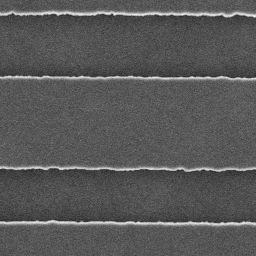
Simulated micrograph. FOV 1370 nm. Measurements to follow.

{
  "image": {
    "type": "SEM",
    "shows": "lines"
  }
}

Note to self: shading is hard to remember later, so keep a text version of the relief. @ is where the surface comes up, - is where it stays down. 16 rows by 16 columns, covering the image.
@@@@@@@@@@@@@@@@
----------------
----------------
----------------
----------------
@@@@@@@@@@@@@@@@
@@@@@@@@@@@@@@@@
@@@@@@@@@@@@@@@@
@@@@@@@@@@@@@@@@
@@@@@@@@@@@@@@@@
@@@@@@@@@@@@@@@@
----------------
----------------
----------------
@@@@@@@@@@@@@@@@
@@@@@@@@@@@@@@@@